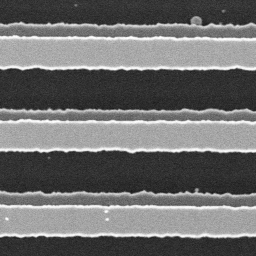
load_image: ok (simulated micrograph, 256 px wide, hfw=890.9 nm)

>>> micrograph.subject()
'lines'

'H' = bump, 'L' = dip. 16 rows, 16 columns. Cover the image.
LLLLLLLLLLLLLLLL
LHLLLLLLLLLLLLLL
HHHHHHHHHHHHHHHH
HHHHHHHHHHHHHHHH
LLLLLLLLLLLLLLLL
LLLLLLLLLLLLLLLL
LLLLLLLLLLLLLLLL
HHHHHHHHHHHHHHHH
HHHHHHHHHHHHHHHH
LLLLLLLLLLLLLLLL
LLLLLLLLLLLLLLLL
LLLLLLLLLLLLLLLL
HHHHHHHHHHHHHHHH
HHHHHHHHHHHHHHHH
HHHHHHHHHHHHHHHH
LLLLLLLLLLLLLLLL